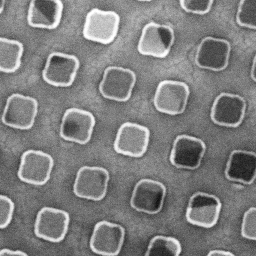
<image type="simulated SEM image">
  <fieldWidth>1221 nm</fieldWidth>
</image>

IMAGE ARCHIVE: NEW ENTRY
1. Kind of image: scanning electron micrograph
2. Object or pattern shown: a regular array of raised bodies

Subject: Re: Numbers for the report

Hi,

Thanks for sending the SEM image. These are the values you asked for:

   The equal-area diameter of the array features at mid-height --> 0.16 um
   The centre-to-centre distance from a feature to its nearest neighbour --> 56.9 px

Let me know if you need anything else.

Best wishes